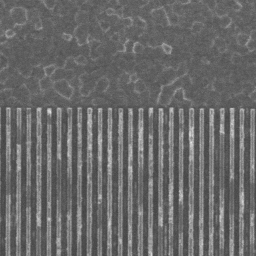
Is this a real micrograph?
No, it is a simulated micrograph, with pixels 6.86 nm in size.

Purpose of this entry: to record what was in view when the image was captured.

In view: parallel lines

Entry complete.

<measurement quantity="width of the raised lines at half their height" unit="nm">26.6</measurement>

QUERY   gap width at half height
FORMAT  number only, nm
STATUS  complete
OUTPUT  40.3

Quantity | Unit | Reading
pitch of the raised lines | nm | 69.8